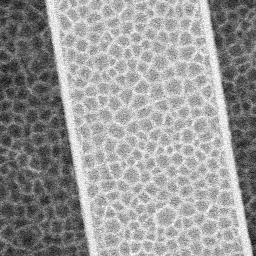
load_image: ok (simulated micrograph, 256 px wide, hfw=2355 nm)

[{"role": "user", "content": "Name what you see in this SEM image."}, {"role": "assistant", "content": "one or a few lines or trenches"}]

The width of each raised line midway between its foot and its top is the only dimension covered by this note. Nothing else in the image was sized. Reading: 1380 nm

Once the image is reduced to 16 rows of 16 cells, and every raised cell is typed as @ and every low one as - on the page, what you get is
---@@@@@@@@@@---
---@@@@@@@@@@---
----@@@@@@@@@---
----@@@@@@@@@---
----@@@@@@@@@---
----@@@@@@@@@@--
----@@@@@@@@@@--
----@@@@@@@@@@--
-----@@@@@@@@@--
-----@@@@@@@@@--
-----@@@@@@@@@--
-----@@@@@@@@@@-
-----@@@@@@@@@@-
-----@@@@@@@@@@-
------@@@@@@@@@-
------@@@@@@@@@-